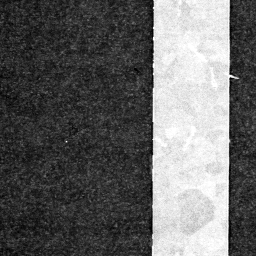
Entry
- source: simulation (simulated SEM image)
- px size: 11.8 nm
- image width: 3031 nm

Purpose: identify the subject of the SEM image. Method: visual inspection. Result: one or a few lines or trenches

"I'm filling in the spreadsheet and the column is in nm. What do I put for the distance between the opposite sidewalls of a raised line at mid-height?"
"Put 892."